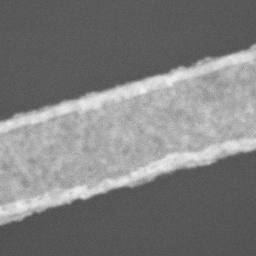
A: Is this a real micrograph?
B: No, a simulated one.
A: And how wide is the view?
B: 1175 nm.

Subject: one or a few lines or trenches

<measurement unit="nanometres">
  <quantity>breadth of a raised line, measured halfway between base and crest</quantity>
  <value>388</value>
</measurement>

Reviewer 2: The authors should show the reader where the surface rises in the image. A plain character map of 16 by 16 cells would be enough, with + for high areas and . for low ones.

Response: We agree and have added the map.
................
................
................
................
............++++
........++++++++
.....+++++++++++
..++++++++++++++
++++++++++++++++
+++++++++++++...
++++++++++......
+++++++.........
+++.............
................
................
................